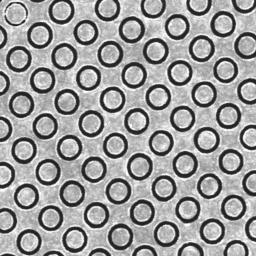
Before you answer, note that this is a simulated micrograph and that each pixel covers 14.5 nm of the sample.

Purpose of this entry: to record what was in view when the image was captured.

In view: a regular array of ring-shaped grooves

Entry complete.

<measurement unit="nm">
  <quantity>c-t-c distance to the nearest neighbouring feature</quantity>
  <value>462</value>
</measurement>